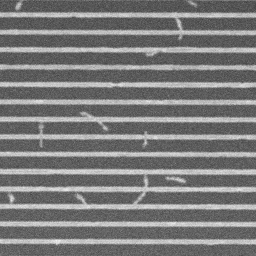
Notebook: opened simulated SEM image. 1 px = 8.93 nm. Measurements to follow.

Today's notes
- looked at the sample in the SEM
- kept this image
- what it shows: parallel lines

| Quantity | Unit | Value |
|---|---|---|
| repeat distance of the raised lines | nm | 155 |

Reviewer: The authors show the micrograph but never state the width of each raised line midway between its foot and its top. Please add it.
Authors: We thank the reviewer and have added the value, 0.0245 um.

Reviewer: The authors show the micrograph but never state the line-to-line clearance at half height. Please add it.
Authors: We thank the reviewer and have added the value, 132 nm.